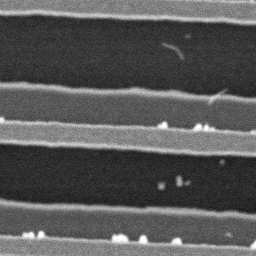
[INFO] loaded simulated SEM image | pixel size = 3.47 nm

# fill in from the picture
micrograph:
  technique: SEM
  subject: lines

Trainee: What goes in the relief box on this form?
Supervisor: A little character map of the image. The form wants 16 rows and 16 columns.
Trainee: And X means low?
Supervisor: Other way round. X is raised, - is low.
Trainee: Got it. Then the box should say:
XXXXXXXXXXXXXXXX
----------------
----------------
----------------
----------------
XXXX------------
XXXXXXXXXXXXXXXX
XXXXXXXXXXXXXXXX
XXXXXXXXXXXXXXXX
----------XXXXXX
----------------
----------------
----------------
XXXXXXXXXXXXXXXX
XXXXXXXXXXXXXXXX
XXXXXXXXXXXXXXXX